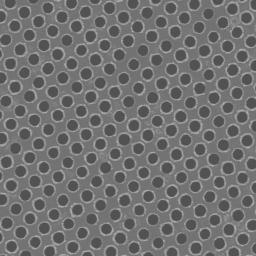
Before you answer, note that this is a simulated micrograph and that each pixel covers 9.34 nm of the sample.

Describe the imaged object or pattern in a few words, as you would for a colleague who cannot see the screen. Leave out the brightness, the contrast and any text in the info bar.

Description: a regular array of holes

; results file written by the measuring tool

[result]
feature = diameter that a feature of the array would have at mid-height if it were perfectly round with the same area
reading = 103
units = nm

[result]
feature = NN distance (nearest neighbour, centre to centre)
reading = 155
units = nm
